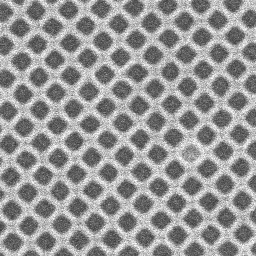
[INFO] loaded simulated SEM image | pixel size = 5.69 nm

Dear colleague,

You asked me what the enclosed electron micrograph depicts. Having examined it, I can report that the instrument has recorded a regular array of holes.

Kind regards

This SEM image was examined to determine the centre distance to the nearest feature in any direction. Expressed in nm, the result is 131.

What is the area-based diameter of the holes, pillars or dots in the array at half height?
0.109 µm